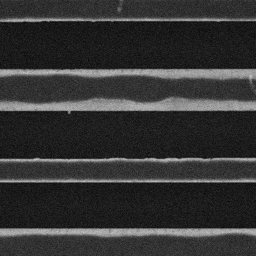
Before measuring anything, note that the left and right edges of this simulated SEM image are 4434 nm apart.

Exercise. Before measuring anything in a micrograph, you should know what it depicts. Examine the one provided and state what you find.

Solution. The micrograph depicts lines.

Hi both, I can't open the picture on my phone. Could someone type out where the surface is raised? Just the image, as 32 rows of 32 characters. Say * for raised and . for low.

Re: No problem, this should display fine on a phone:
********************************
********************************
********************************
................................
................................
................................
................................
................................
................................
********************************
********************************
********************************
********************************
..*****..........***............
................................
................................
................................
................................
................................
................................
********************************
********************************
********************************
................................
................................
................................
................................
................................
................................
********************************
********************************
********************************